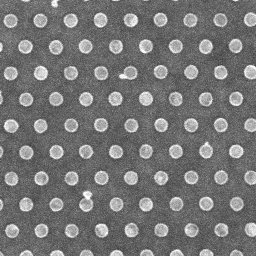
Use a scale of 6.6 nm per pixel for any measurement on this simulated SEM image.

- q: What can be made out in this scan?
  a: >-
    a regular array of raised bodies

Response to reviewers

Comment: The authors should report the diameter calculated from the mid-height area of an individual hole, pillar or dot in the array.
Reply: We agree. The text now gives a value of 87.5 nm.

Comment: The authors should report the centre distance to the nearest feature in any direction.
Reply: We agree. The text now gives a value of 196 nanometres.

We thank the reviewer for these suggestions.